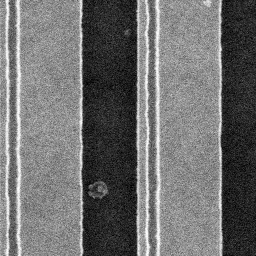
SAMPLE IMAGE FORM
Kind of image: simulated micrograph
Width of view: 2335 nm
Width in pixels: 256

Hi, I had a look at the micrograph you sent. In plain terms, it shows lines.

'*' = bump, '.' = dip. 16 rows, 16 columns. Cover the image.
*****....*****..
*****....*****..
*****....*****..
*****....*****..
*****....*****..
*****....*****..
*****....*****..
*****....*****..
*****....*****..
*****....*****..
*****....*****..
*****....*****..
*****....*****..
*****....*****..
*****....*****..
*****....*****..